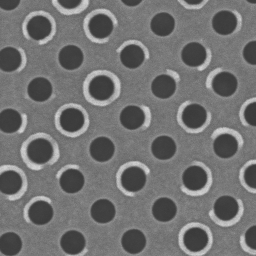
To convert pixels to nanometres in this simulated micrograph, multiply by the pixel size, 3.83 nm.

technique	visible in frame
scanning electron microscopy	a regular array of holes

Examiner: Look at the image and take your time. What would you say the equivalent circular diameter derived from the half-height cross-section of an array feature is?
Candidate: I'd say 0.0953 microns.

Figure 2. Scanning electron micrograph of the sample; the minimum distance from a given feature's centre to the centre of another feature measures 166 nanometers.